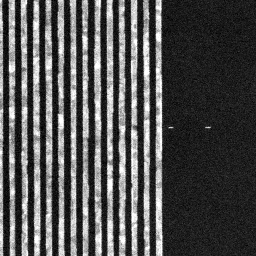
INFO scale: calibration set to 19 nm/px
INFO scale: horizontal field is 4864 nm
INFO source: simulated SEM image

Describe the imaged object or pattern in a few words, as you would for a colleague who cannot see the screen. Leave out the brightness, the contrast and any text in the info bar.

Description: parallel lines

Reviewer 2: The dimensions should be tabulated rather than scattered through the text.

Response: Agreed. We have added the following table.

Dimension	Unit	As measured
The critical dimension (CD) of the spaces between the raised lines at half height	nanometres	142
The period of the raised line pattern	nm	232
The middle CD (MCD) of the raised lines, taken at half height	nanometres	87.9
